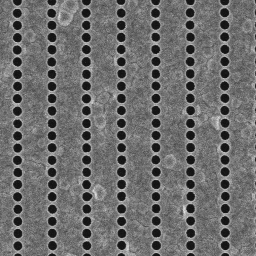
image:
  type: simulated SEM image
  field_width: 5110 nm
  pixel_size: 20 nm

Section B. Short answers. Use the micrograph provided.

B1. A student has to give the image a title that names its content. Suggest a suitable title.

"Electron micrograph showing a regular array of holes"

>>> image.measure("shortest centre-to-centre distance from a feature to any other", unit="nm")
239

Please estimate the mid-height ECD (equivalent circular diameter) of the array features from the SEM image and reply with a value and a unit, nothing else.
9.16 pixels